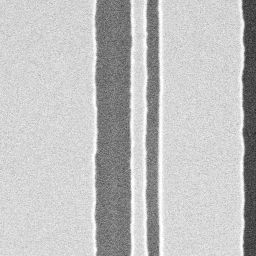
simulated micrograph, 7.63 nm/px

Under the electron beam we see lines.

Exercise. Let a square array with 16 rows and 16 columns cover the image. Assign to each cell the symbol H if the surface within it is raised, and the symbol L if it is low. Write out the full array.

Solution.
HHHHHHLLHHHHHHHL
HHHHHHLLHHHHHHHL
HHHHHHLLHHHHHHHL
HHHHHHLLHHHHHHHL
HHHHHHLLHHHHHHHL
HHHHHHLLHHHHHHHL
HHHHHHLLHHHHHHHL
HHHHHHLLHHHHHHHL
HHHHHHLLHHHHHHHL
HHHHHHLLHHHHHHHL
HHHHHHLLHHHHHHHL
HHHHHHLLHHHHHHHL
HHHHHHLLHHHHHHHL
HHHHHHLLHHHHHHHL
HHHHHHLLHHHHHHHL
HHHHHHLLHHHHHHHL